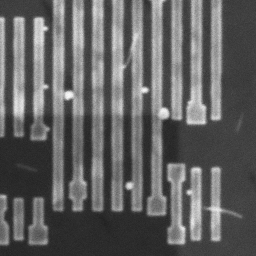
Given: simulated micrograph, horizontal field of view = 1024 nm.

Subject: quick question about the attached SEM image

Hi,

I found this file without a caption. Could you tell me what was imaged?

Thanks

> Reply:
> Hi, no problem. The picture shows wiring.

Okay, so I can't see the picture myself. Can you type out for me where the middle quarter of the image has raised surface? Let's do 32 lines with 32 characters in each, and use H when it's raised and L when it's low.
LLLHHLLHHHLLHHHLLHHHLLHHLLLHHLLL
LLLHHLLHHHLLHHHLLHHHLLHHLLLHHLLL
LLLHHLLHHHLLHHLLLHHHLLHHLLLHHLLL
LLLHHLLHHHLLHHHLLHHHLLHHLLLHHLLL
LLLHHLLHHHLLHHHLLHHLLLHHLLLHHLLL
LLLHHLLHHHLLHHHLLHHLLLHHLLLHHLLL
LLLHHLLHHHLLHHHLLHHHHLHHLLLHHLLL
HHHHHLLHHHLLHHHLLHHHLLHHLLLHHLLL
HHHHHLLHHHLLHHHLLHHLLLHHLLLHHLLL
LLLHHLLHHHLLHHHLLHHLLLHHLLLHHLLH
LLHHHLLHHHLLHHLLLHHLLLHHLLLHHLLH
LLHHHLLHHHLLHHLLLHHLLLHHHHLHHLLH
LLHHHLLHHHLLHHHLLHHLLLHHHHLHHLLH
LLHHHLLHHHLLHHHLLHHLLLHHHHLHHLLH
LLHHHLLHHHLLHHHLLHHLLLHHLLLLLLLH
LLHHHLLHHHLLHHHLLHHLLLHHLLLLLLLL
LLHHHLLHHHLLHHHLLHHLLLHHLLLLLLLL
LLHHHLLHHHLLHHLLLHHLLLHHLLLLLLLL
LLHHHLLHHHLLHHHLLHHLLLHHLLLLLLLL
LLHHHLLHHHLLHHHLLHHLLLHHLLLLLLLL
LLHHHLLHHHLLHHHLLHHLLLHHLLLLLLLL
LLHHHLLHHHLLHHHLLHHLLLHHLLLLLLLL
LLHHHLLHHHLLHHLLLHHLLLHHLLLLLLLL
LLHHLLLHHHLLHHLLLHHLLLHHLLLLLLLL
LLHHLLLHHHLLHHLLLHHLLLHHLLLLLLLL
LLHHLLLHHHLLHHLLLHHLLLHHLLHHHHLL
LLHHLLLHHHLLHHLLLHHLLLHHLLHHHHLL
LLHHHLLHHHLLHHLLLHHLLLHHLLHHHHLL
LLHHHLLHHHLLHHLLLHHLLLHHLLHHHHLL
LLHHHLLHHHLLHHLLLHHLLLHHLLLHHHLL
LHHHHHLHHHLLHHLLHHHLLLHHLLLHHLLL
LHHHHHLHHHLLHHLLLHHLLLHHLLLHHLLL